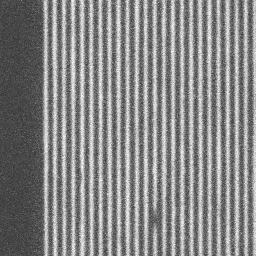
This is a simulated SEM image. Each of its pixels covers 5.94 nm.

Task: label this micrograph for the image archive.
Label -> parallel lines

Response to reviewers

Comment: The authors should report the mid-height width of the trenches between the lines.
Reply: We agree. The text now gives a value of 39.3 nanometres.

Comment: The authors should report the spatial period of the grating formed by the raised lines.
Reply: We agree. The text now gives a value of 0.054 um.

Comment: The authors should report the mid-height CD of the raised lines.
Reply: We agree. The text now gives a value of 11.1 nm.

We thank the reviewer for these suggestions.